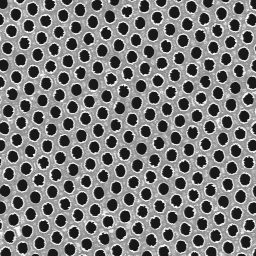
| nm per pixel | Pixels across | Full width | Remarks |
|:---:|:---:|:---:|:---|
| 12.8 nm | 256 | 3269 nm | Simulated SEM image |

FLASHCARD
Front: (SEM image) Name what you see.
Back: a regular array of holes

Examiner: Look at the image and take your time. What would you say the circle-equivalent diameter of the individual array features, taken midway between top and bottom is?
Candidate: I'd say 142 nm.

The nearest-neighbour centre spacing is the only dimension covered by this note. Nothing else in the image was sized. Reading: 0.22 micrometres